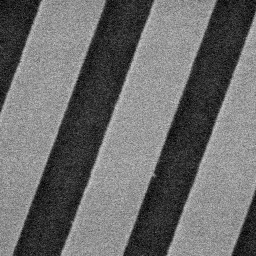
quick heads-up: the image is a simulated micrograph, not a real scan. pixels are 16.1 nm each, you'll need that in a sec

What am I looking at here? lines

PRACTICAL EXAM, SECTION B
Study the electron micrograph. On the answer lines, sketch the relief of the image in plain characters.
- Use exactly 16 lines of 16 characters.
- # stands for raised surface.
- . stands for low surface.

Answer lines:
..####....###...
..####...####...
..####...####..#
.####...####...#
.####...####...#
.####...###...##
####...####...##
####...####...##
###....###...###
###...####...###
###...####..####
##...####...####
##...####...####
##...####..####.
#...####...####.
#...####...####.